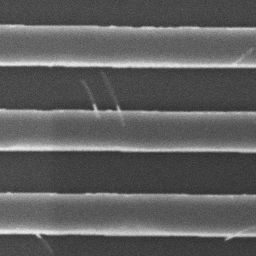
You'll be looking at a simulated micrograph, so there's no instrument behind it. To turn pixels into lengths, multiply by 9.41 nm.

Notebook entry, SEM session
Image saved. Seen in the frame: lines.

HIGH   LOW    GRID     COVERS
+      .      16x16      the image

................
................
++++++++++++++++
++++++++++++++++
................
................
................
++++++++++++++++
++++++++++++++++
................
................
................
++++++++++++++++
++++++++++++++++
++++++++++++++++
................